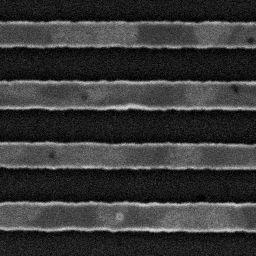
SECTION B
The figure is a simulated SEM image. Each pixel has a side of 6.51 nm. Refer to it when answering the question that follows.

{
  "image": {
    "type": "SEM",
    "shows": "lines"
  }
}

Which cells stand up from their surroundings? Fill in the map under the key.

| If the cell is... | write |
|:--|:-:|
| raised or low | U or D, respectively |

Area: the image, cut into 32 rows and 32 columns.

DDDDDDDDDDDDDDDDDDDDDDDDDDDDDDDD
DDDDDDDDDDDDDDDDDDDDDDDDDDDDDDDD
DDDDDDDDDDDDDDDDDDDDDDDDDDDDDDDD
UUUUUUUUUUUUUUUUUUUUUUUUUUUUUUUU
UUUUUUUUUUUUUUUUUUUUUUUUUUUUUUUU
UUUUUUUUUUUUUUUUUUUUUUUUUUUUUUUU
DDDDDDDDDDDDDDDDDDDDDDDDDDDDDDDD
DDDDDDDDDDDDDDDDDDDDDDDDDDDDDDDD
DDDDDDDDDDDDDDDDDDDDDDDDDDDDDDDD
DDDDDDDDDDDDDDDDDDDDDDDDDDDDDDDD
UUUUUUUUUUUUUUUUUUUUUUUUUUUUUUUU
UUUUUUUUUUUUUUUUUUUUUUUUUUUUUUUU
UUUUUUUUUUUUUUUUUUUUUUUUUUUUUUUU
UUUUDUUUUUUUUUUUDUUUUUUUUUUUUUUU
DDDDDDDDDDDDDDDDDDDDDDDDDDDDDDDD
DDDDDDDDDDDDDDDDDDDDDDDDDDDDDDDD
DDDDDDDDDDDDDDDDDDDDDDDDDDDDDDDD
DDDDDDDDDDDDDDDDDDDDDDDDDDDDDDDD
UUUUUUUUUUUUUUUUUUUUUUUUUUUUUUUU
UUUUUUUUUUUUUUUUUUUUUUUUUUUUUUUU
UUUUUUUUUUUUUUUUUUUUUUUUUUUUUUUU
DDDDDDDDDDDDDDDDDDDDDDDDDDDDDDDD
DDDDDDDDDDDDDDDDDDDDDDDDDDDDDDDD
DDDDDDDDDDDDDDDDDDDDDDDDDDDDDDDD
DDDDDDDDDDDDDDDDDDDDDDDDDDDDDDDD
UUUUUUUUUUUUUUUUUUUUUUUUUUUUUUUU
UUUUUUUUUUUUUUUUUUUUUUUUUUUUUUUU
UUUUUUUUUUUUUUUUUUUUUUUUUUUUUUUU
UUUUUUUUUUUUUUUUUUUUUUUUUUUUUUUU
DDDDDDDDDDDDDDDDDDDDDDDDDDDDDDDD
DDDDDDDDDDDDDDDDDDDDDDDDDDDDDDDD
DDDDDDDDDDDDDDDDDDDDDDDDDDDDDDDD